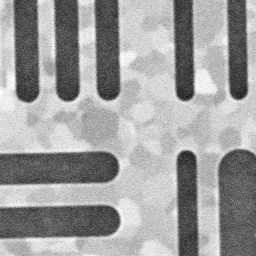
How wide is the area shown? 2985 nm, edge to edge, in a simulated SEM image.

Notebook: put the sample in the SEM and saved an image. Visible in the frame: groups of lines, slits or small figures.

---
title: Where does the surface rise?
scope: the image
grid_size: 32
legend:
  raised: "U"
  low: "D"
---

UDDDDUUDDDUUDDDUUUUUUDDDUUUUDDDU
UUDDDUUDDDUUDDDUUUUUUDDDUUUUDDDU
UUDDDUUDDDUUDDDUUUUUUUDDUUUUDDDU
UUDDDUUDDDUUDDDUUUUUUUDDUUUUDDDU
UUDDDUUDDDUUDDDUUUUUUUDDUUUUDDDU
UUDDDUUDDDUUDDDUUUUUUUDDUUUUDDDU
UUDDDUUDDDUUDDDUUUUUUUDDUUUUDDDU
UUDDDUUDDDUUDDDUUUUUUUDDUUUUDDDU
UUDDDUUDDDUUDDDUUUUUUUDDUUUUDDDU
UUDDDUUDDDUUDDDUUUUUUUDDUUUUDDDU
UUDDDUUDDDUUDDDUUUUUUUDDUUUUDDDU
UUDDDUUDDDUUDDDUUUUUUUDDUUUUUDDU
UUDDDUUUDUUUUDUUUUUUUUDDUUUUUDUU
UUUUUUUUUUUUUUUUUUUUUUUUUUUUUUUU
UUUUUUUUUUUUUUUUUUUUUUUUUUUUUUUU
UUUUUUUUUUUUUUUUUUUUUUUUUUUUUUUU
UUUUUUUUUUUUUUUUUUUUUUUUUUUUUUUU
UUUUUUUUUUUUUUUUUUUUUUUUUUUUUUUU
UUUUUUUUUUUUUUUUUUUUUUUUUUUUUUUU
DDDDDDDDDDDDDDUUUUUUUUDDDUUUDDDD
DDDDDDDDDDDDDDDUUUUUUUDDDUUDDDDD
DDDDDDDDDDDDDDDUUUUUUUDDDUUDDDDD
DDDDDDDDDDDDDDUUUUUUUUDDDUUDDDDD
UUUUUUUUUUUUUUUUUUUUUUDDDUUDDDDD
UUUUUUUUUUUUUUUUUUUUUUDDDUUDDDDD
UUUUUUUUUDDDDUUUUUUUUUDDDUUDDDDD
DDDDDDDDDDDDDDDUUUUUUUDDDUUDDDDD
DDDDDDDDDDDDDDDUUUUUUUDDDUUDDDDD
DDDDDDDDDDDDDDDUUUUUUUDDDUUDDDDD
DDDDDDDDDDDDDDUUUUUUUUDDDUUDDDDD
UUUUUUUUUUUUUUUUUUUUUUDDDUUDDDDD
UUUUUUUUUUUUUUUUUUUUUUDDDUUDDDDD